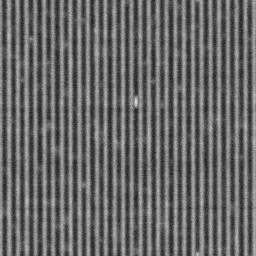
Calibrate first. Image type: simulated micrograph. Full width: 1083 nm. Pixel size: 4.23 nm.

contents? parallel lines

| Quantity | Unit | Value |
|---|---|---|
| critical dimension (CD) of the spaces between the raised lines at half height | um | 0.0259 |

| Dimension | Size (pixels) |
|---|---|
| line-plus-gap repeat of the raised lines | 8.77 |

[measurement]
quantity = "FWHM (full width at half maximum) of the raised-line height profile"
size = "12.7 nm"